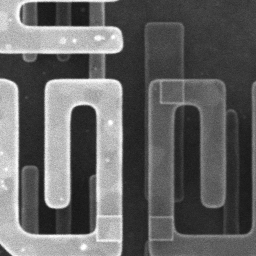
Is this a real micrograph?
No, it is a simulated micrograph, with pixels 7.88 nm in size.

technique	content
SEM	wiring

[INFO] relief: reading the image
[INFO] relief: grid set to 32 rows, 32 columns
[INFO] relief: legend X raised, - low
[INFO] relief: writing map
XXX-----------------------------
XX------------------------------
XXX-----------------------------
XXXXXXXXXXXXXXX-----------------
XXXXXXXXXXXXXXX-----------------
XXXXXXXXXXXXXXX-----------------
XXXXXXXXXXXXXXX-----------------
--------------------------------
--------------------------------
--------------------------------
XX----XXXXXXXXX----XXXXXXXXX----
XX----XXXXXXXXX----XXXXXXXXX----
XX----XXXXXXXXX----XXXXXXXXX----
XX----XXX---XXX----XXX---XXX----
XX----XXX---XXX----XXX---XXX----
XX----XXX---XXX----XXX---XXX----
XX----XXX---XXX----XXX---XXX----
XX----XXX---XXX----XXX---XXX----
XX----XXX---XXX----XXX---XXX----
XX----XXX---XXX----XXX---XXX----
XX----XXX---XXX----XXX---XXX----
XX----XXX---XXX----XXX---XXX----
XX----XXX---XXX----XXX---XXX----
XX----XXX---XXX----XXX---XXX----
XX----XXX---XXX----XXX---XXX----
XX----XX----XXX----XXX---XXX----
XX----------XXX----XXX----------
XX----------XXX----XXX----------
XXX---------XXX----XXX---------X
XXXXXXXXXXXXXXX----XXXXXXXXXXXXX
XXXXXXXXXXXXXXX----XXXXXXXXXXXXX
-XXXXXXXXXXXXXX----XXXXXXXXXXXXX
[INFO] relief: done